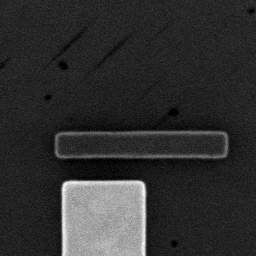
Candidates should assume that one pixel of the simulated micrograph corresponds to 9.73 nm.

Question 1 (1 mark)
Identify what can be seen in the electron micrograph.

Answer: wiring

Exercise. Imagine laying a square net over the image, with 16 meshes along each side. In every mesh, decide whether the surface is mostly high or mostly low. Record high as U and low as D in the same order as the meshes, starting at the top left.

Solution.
DDDDDDDDDDDDDDDD
DDDDDDDDDDDDDDDD
DDDDDDDDDDDDDDDD
DDDDDDDDDDDDDDDD
DDDDDDDDDDDDDDDD
DDDDDDDDDDDDDDDD
DDDDDDDDDDDDDDDD
DDDDDDDDDDDDDDDD
DDDDUUUUUUUUUUDD
DDDDUUUUUUUUUUDD
DDDDDDDDDDDDDDDD
DDDDUUUUUDDDDDDD
DDDDUUUUUDDDDDDD
DDDDUUUUUDDDDDDD
DDDDUUUUUDDDDDDD
DDDDUUUUUDDDDDDD